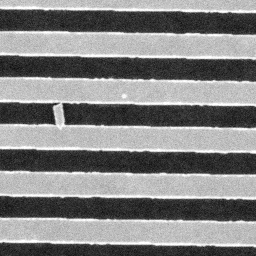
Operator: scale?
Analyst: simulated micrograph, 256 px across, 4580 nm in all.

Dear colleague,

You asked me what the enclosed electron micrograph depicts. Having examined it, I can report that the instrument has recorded lines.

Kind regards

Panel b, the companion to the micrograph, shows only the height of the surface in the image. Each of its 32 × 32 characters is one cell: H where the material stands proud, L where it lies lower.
HHHHHHHHHHHHHHHHHHHHHHHHHHHHHHHH
LLLLLLLLLLLLLLLLLLLLLLLLLLLLLHHH
LLLLLLLLLLLLLLLLLLLLLLLLLLLLLLLL
LLLLLLLLLLLLLLLLLLLLLLLLLLLLLLLL
HHHHHHHHHHHHHHHHHHHHHHHHHHHHHHHH
HHHHHHHHHHHHHHHHHHHHHHHHHHHHHHHH
HHHHHHHHHHHHHHHHHHHHHHHHHHHHHHHH
LLLLLLLLLLLLLLLLLLLLLLLLLLLLLLLL
LLLLLLLLLLLLLLLLLLLLLLLLLLLLLLLL
LLLLLLLLLLLLLLLLLLLLLLLLLLLLLLLL
HHHHHHHHHHHHHHHHHHHHHHHHHHHHHHHH
HHHHHHHHHHHHHHHHHHHHHHHHHHHHHHHH
HHHHHHHHHHHHHHHHHHHHHHHHHHHHHHHH
LLLLLLLHLLLLLLLLLLLLLLLLLLLLLLLL
LLLLLLLHLLLLLLLLLLLLLLLLLLLLLLLL
LLLLLLLHLLLLLLLLLLLLLLLLLLLLLLLL
HHHHHHHHHHHHHHHHHHHHHHHHHHHHHHHH
HHHHHHHHHHHHHHHHHHHHHHHHHHHHHHHH
HHHHHHHHHHHHHHHHHHHHHHHHHHHHHHHH
LLLLLLLLLLLLLLLLLLLLLLLLLLLLLLLL
LLLLLLLLLLLLLLLLLLLLLLLLLLLLLLLL
HHHHLLLLLLLLLLLLLLLLLLLLLLLLLLLL
HHHHHHHHHHHHHHHHHHHHHHHHHHHHHHHH
HHHHHHHHHHHHHHHHHHHHHHHHHHHHHHHH
LLLLLLHHHHHHHHHHHHHHHHHHHHHHHHHH
LLLLLLLLLLLLLLLLLLLLLLLLLLLLLLLL
LLLLLLLLLLLLLLLLLLLLLLLLLLLLLLLL
HHHHHHHHHHHHHHLLLLLLLLLLLLLLLLLL
HHHHHHHHHHHHHHHHHHHHHHHHHHHHHHHH
HHHHHHHHHHHHHHHHHHHHHHHHHHHHHHHH
LLLLLLLLLLLLLLLLLLLLLHHHHHHHHHHH
LLLLLLLLLLLLLLLLLLLLLLLLLLLLLLLL